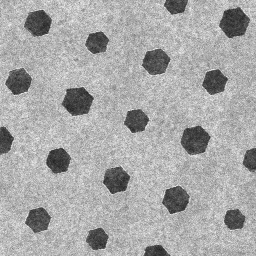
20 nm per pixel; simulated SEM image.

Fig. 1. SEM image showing a regular array of holes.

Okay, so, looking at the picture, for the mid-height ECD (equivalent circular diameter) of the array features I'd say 516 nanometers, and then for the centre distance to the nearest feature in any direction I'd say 1230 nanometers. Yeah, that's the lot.